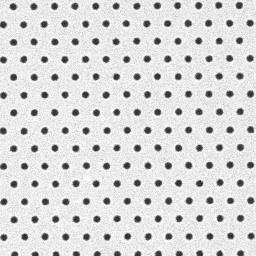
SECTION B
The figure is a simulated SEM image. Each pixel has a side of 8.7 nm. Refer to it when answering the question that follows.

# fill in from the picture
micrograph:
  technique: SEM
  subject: a regular array of holes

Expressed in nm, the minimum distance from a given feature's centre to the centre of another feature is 175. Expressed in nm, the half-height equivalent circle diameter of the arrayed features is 66.5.